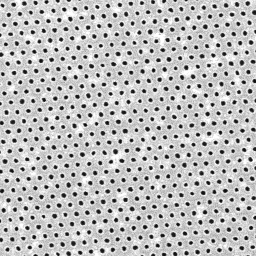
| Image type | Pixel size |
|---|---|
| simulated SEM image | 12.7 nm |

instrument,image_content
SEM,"a regular array of holes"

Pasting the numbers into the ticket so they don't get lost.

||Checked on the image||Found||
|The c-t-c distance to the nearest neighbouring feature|136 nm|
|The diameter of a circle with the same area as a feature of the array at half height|0.0592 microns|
